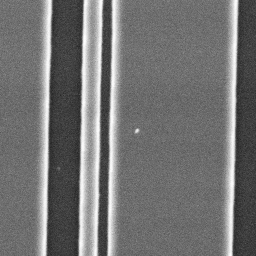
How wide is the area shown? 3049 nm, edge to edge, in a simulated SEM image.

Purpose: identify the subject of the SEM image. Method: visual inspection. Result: lines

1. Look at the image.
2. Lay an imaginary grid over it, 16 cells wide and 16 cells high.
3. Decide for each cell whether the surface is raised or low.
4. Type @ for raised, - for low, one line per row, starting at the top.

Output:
@@@--@@@@@@@@@@-
@@@--@@@@@@@@@@-
@@@--@@@@@@@@@@-
@@@--@@@@@@@@@@-
@@@--@@@@@@@@@@-
@@@--@@@@@@@@@@-
@@@--@@@@@@@@@@-
@@@--@@@@@@@@@@-
@@@--@@@@@@@@@@-
@@@--@@@@@@@@@@-
@@@--@@@@@@@@@@-
@@@--@@@@@@@@@@-
@@@--@@@@@@@@@--
@@@--@@@@@@@@@--
@@@--@@@@@@@@@--
@@@--@@@@@@@@@--